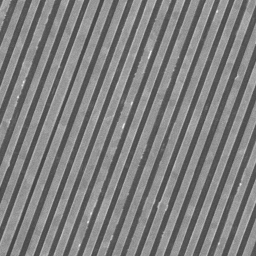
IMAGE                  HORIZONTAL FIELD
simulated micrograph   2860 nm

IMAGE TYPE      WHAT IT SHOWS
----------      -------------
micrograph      parallel lines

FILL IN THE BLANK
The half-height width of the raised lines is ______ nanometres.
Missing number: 89.2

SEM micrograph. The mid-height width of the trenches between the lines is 0.0668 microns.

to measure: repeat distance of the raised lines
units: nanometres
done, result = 152